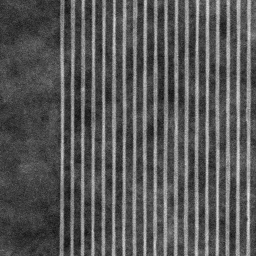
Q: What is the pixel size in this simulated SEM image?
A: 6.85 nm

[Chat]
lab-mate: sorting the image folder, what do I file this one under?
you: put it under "parallel lines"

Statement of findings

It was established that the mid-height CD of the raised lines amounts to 17.1 nanometres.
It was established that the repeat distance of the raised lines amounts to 0.0709 micrometres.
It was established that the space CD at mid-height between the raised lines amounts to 53.1 nanometers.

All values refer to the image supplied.